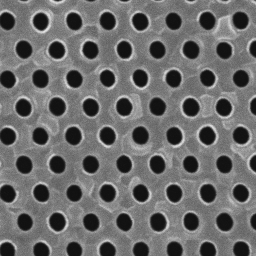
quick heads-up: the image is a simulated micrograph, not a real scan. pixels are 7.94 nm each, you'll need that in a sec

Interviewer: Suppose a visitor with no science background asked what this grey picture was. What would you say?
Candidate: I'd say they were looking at a regular array of holes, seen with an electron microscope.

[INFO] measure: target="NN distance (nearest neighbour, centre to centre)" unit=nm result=260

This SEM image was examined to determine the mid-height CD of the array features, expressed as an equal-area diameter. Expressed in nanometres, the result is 134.